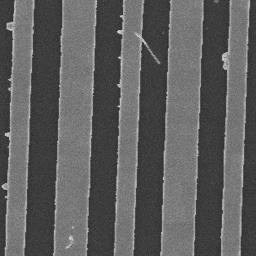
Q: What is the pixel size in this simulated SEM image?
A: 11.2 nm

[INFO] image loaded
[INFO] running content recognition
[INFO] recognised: lines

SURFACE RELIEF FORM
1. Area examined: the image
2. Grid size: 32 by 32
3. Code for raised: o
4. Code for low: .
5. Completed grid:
..oo....oooo...ooo...oooo....oo.
..oo....oooo...ooo...oooo....oo.
..oo....oooo...ooo...oooo....oo.
.ooo....oooo...ooo...oooo....oo.
..oo....oooo...ooo...oooo....oo.
..oo....oooo...ooo...oooo....oo.
..oo....oooo...ooo...oooo...ooo.
..oo....oooo...ooo...oooo...ooo.
..oo....oooo...ooo...oooo...ooo.
..oo....oooo...oo....oooo...ooo.
..oo....oooo...oo....oooo...ooo.
.ooo....oooo...oo....oooo...ooo.
.ooo...ooooo...oo....oooo...ooo.
.ooo...ooooo...oo....oooo...ooo.
.ooo...ooooo...oo....oooo...ooo.
.ooo...oooo....oo....oooo...ooo.
.ooo...oooo....oo....oooo...ooo.
.ooo...oooo....oo....oooo...ooo.
.ooo...oooo....oo....oooo...oo..
.ooo...oooo....oo....oooo...oo..
.oo....oooo....oo....oooo...oo..
.oo....oooo....oo....oooo...oo..
.oo....oooo....oo...ooooo...oo..
.oo....oooo....oo...ooooo...oo..
.oo....oooo....oo...ooooo...oo..
.oo....oooo....oo...oooo....oo..
.oo....oooo....oo...oooo....oo..
.oo....oooo...ooo...oooo....oo..
.oo....oooo...ooo...oooo....oo..
.oo....oooo...ooo...oooo....oo..
.oo....oooo...ooo...oooo....oo..
.oo....oooo...ooo...oooo....oo..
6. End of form